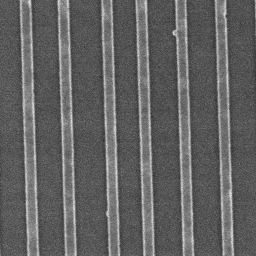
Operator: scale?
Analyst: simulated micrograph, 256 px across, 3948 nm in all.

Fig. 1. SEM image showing parallel lines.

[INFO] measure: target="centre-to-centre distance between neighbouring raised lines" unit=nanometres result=601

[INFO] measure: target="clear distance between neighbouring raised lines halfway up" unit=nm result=455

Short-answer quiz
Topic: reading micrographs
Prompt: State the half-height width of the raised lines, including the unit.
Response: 156 nanometers